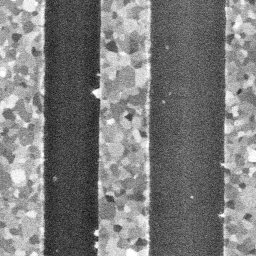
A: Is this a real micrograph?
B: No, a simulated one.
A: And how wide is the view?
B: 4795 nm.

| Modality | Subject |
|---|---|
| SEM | lines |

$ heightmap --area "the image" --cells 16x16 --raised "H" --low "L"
HHHLLLHHHLLLLLHH
HHHLLLHHHLLLLLHH
HHHLLLHHHLLLLLHH
HHHLLLHHHLLLLLHH
HHHLLLHHHLLLLLHH
HHHLLLHHHLLLLLHH
HHHLLLHHHLLLLLHH
HHHLLLHHHLLLLLHH
HHHLLLHHHLLLLLHH
HHHLLLHHHLLLLLHH
HHHLLLHHHLLLLLHH
HHHLLLHHHLLLLLHH
HHHLLLHHHLLLLLHH
HHHLLLHHHLLLLLHH
HHHLLLHHHLLLLLHH
HHHLLLHHHLLLLLHH